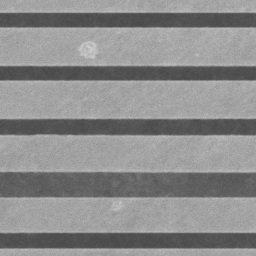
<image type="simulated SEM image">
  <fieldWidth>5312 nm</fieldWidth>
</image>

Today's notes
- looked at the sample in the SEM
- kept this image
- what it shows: lines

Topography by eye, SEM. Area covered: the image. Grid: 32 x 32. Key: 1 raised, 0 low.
11111111111111111111111111111111
11111111111111111111111111111111
00000000000000000000000000000000
00000000000000000000000001000000
11111111111111111111111111111111
11111111111111111111111111111111
11111111111111111111111111111111
11111111111111111111111111111111
00000000000000000000000000000000
00000000000000000000000000000000
11111111111111111111111111111111
11111111111111111111111111111111
11111111111111111111111111111111
11111111111111111111111111111111
11111111111111111111111111111111
00000000000000000000000000000000
00000000000000000000000000000000
11111111111111111111111111111111
11111111111111111111111111111111
11111111111111111111111111111111
11111111111111111111111111111111
00000000000000111011111111111111
00000000000000000000000000000000
00000000000000000000000000000000
00000000000000000000000000000000
11111111111111111111111111111111
11111111111111111111111111111111
11111111111111111111111111111111
11111111111111111111111111111111
00000000000000000000000000000000
00000000000000000000000000000000
11111111111111111111111111111111